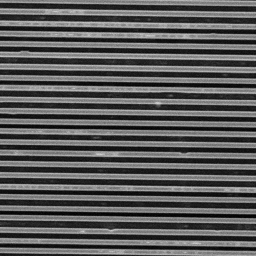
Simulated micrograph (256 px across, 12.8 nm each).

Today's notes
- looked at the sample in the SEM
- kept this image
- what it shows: parallel lines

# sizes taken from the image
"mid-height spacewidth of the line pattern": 73.6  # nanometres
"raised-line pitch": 0.139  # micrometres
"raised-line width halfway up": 60.8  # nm